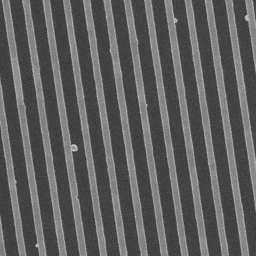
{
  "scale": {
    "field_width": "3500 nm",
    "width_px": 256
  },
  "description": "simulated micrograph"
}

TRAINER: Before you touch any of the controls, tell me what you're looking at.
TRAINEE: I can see parallel lines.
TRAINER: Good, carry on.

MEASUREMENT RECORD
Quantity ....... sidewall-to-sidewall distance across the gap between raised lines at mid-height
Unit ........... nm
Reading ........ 184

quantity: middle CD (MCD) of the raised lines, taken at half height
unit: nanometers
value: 91.3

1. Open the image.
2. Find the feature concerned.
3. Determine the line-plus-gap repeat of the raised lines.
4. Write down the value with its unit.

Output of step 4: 274 nanometres